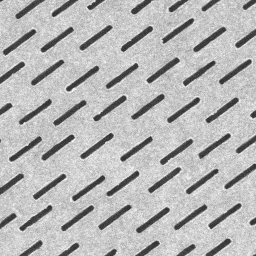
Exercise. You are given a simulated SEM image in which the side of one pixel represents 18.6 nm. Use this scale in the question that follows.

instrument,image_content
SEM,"a regular array of holes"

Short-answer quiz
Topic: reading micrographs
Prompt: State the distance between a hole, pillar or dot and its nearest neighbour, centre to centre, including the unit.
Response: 0.644 microns